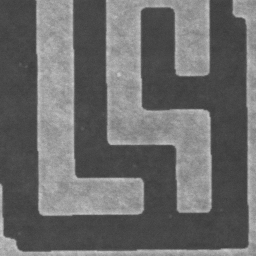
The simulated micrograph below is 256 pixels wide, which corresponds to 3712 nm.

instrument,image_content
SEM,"wiring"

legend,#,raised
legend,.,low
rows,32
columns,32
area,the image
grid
.....####.....############....##
.....####.....###.....####....##
.....####.....###.....####.....#
.....####.....###.....####.....#
.....####.....###.....####.....#
.....####.....###.....####.....#
.....####.....###.....####.....#
.....####.....###.....####.....#
.....####.....###.....####.....#
.....####.....###..............#
.....####.....###..............#
.....####.....###..............#
.....####.....###..............#
.....####.....###..............#
.....####.....############.....#
.....####.....############.....#
.....####.....############.....#
.....####.....############.....#
.....####.............####.....#
.....####.............####.....#
.....####.............####.....#
.....####.............####.....#
.....####.............####.....#
.....#############....####.....#
.....#############.....###.....#
.....#############.....###.....#
......####.#...................#
...............................#
...............................#
...............................#
#..............................#
##............................##